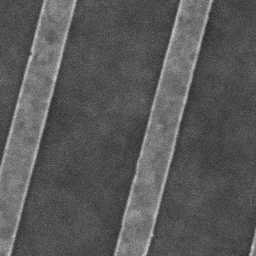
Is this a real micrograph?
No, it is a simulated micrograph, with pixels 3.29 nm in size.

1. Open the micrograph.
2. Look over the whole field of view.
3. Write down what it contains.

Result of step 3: one or a few lines or trenches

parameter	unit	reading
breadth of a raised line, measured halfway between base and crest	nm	99.9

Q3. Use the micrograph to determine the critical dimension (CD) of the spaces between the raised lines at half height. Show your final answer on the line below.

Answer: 334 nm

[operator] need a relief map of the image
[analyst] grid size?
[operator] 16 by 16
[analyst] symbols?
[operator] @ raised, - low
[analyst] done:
---@@------@@---
--@@-------@@---
--@@-------@@---
--@@------@@----
--@@------@@----
-@@-------@@----
-@@-------@@----
-@@------@@-----
-@@------@@-----
@@-------@@-----
@@-------@@-----
@@------@@------
@@------@@------
@-------@@------
@-------@@------
@------@@-------